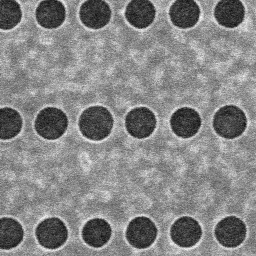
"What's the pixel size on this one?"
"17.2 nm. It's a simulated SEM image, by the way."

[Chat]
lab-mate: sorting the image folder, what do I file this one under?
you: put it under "a regular array of holes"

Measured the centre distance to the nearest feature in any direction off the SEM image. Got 768 nm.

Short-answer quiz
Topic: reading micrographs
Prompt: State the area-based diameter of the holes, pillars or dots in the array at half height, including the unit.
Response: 0.572 microns